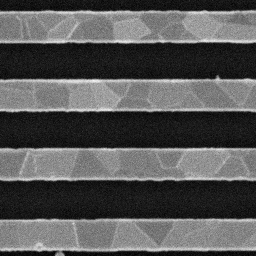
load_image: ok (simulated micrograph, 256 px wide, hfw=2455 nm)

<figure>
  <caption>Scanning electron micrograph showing lines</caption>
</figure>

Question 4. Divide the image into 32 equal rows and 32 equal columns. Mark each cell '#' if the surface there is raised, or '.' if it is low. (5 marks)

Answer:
................................
.....................##........#
################################
################################
################################
................................
................................
................................
................................
................................
################################
################################
################################
################################
................................
................................
................................
................................
................................
################################
################################
################################
......#..........#.#........#...
................................
................................
................................
................................
............##.......###.##....#
################################
################################
################################
................................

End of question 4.